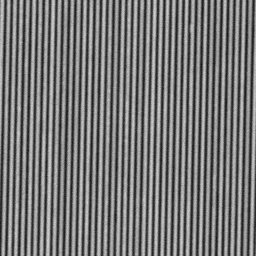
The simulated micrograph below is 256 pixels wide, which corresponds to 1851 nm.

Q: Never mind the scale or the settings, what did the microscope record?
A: parallel lines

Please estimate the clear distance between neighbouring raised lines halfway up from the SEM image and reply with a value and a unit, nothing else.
20.8 nanometers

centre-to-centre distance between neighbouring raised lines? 46 nm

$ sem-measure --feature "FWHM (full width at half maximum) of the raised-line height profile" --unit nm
20.8